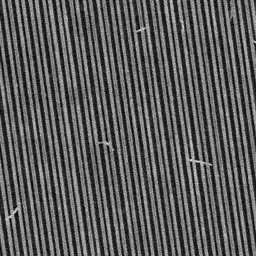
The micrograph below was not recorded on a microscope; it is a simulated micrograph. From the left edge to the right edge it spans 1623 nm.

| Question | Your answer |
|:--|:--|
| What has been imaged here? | parallel lines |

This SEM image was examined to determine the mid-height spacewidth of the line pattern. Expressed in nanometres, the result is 28.3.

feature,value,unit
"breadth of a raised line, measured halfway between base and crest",16.5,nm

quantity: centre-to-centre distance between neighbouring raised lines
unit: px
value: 6.67